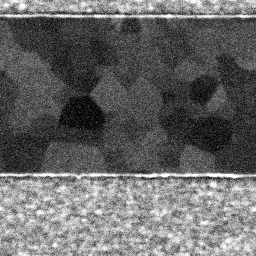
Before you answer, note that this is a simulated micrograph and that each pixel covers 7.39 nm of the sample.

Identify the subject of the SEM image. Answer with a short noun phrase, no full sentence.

one or a few lines or trenches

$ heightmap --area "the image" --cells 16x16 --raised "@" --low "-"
----------------
@@@@@@@@@@@@@@@@
@@@@@@@@@@@@@@@@
@@@@@@@@@@@@@@@@
@@@@@@@@@@@@@@@@
@@@@@@@@@@@@@@@@
@@@@@@@@@@@@@@@@
@@@@@@@@@@@@@@@@
@@@@@@@@@@@@@@@@
@@@@@@@@@@@@@@@@
@@@@@@@@@@@@@@@@
----------------
----------------
----------------
----------------
----------------